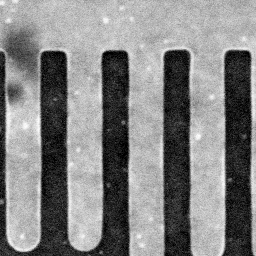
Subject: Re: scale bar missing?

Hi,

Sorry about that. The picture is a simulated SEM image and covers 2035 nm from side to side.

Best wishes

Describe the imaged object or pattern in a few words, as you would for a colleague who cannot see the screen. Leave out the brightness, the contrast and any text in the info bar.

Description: groups of lines, slits or small figures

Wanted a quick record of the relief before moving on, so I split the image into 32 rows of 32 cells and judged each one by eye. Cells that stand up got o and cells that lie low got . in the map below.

oooooooooooooooooooooooooooooooo
oooooooooooooooooooooooooooooooo
oooooooooooooooooooooooooooooooo
oooooooooooooooooooooooooooooooo
oooooooooooooooooooooooooooooooo
oooooooooooooooooooooooooooooooo
ooooo...ooooo...ooooo...oooo...o
.oooo....oooo...oooo....oooo...o
.oooo....oooo...oooo....oooo...o
.oooo....oooo...oooo....oooo...o
.oooo....oooo...oooo....oooo...o
.oooo....oooo...oooo....oooo...o
.oooo....oooo...oooo....oooo....
.oooo....oooo...oooo....oooo....
.oooo....oooo...oooo....oooo....
.oooo....oooo...oooo....oooo....
.oooo....oooo...oooo....oooo...o
.oooo....oooo...oooo....oooo...o
.oooo....oooo...oooo....oooo...o
.oooo....oooo...oooo....oooo...o
.oooo....oooo...oooo....oooo...o
.oooo....oooo...oooo....oooo...o
.oooo....oooo...oooo....oooo...o
.oooo....oooo...oooo....oooo...o
.oooo....oooo...oooo....oooo...o
.oooo....oooo...oooo....oooo...o
.oooo....oooo...oooo....oooo...o
.oooo....oooo...oooo....oooo...o
.oooo....oooo...oooo....oooo....
.oooo....oooo...oooo....oooo....
.oooo....ooo....oooo....oooo....
................oooo....oooo....